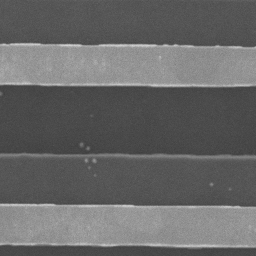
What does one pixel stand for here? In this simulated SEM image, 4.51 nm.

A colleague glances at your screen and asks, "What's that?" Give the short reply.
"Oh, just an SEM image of lines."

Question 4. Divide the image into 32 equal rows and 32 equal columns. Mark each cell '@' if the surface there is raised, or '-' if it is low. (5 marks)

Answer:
@@@@@@@@@@@@@@@@@@@@@@@@@@@@@@@@
@@@@@@@@@@@@@@@@@@@@@@@@@@@@@@@@
@@@@@@@@@@@@@@@@@@@@@@@@@@@@@@@@
@@@@@@@@@@@@@@@@@@@@@@@@@@@@@@@@
@@@@@@@@@@@@@@@@@@@@@@@@@@@@@@@@
@@@@@@@@@@@@@@@@@@@@@@@@@@@@@@@@
@@@@@@@@@@@@@@@@@@@@@@@@@@@@@@@@
@@@@@@@@@@@@@@@@@@@@@@@@@@@@@@@@
@@@@@@@@@@@@@@@@@@@@@@@@@@@@@@@@
@@@@@@@@@@@@@@@@@@@@@@@@@@@@@@@@
----@@@@@@@@@@@@@@@@@@@@@@@@@@@@
--------------------------------
--------------------------------
--------------------------------
--------------------------------
--------------------------------
--------------------------------
--------------------------------
--------------------------------
@@@@@@@@@@@@@@@@@@@@@@@@--------
@@@@@@@@@@@@@@@@@@@@@@@@@@@@@@@@
@@@@@@@@@@@@@@@@@@@@@@@@@@@@@@@@
@@@@@@@@@@@@@@@@@@@@@@@@@@@@@@@@
@@@@@@@@@@@@@@@@@@@@@@@@@@@@@@@@
@@@@@@@@@@@@@@@@@@@@@@@@@@@@@@@@
@@@@@@@@@@@@@@@@@@@@@@@@@@@@@@@@
@@@@@@@@@@@@@@@@@@@@@@@@@@@@@@@@
@@@@@@@@@@@@@@@@@@@@@@@@@@@@@@@@
@@@@@@@@@@@@@@@@@@@@@@@@@@@@@@@@
@@@@@@@@@@@@@@@@@@@@@@@@@@@@@@@@
@@@@@@@@@@@@@@@@@@@@@@@@@@@@@@@@
--------------------------------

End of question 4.